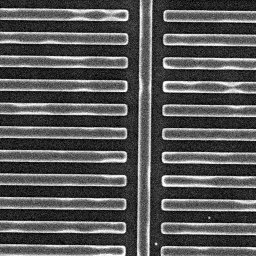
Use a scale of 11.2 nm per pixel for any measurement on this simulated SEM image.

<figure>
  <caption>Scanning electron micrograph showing groups of lines, slits or small figures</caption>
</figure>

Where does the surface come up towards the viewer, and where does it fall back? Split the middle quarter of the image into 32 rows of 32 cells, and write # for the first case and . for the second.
################...###...#######
...................###..........
...................###..........
...................###..........
###############....###..........
################...##....#######
################...##....#######
...................###..........
...................###..........
...................###..........
################...###...#######
################...###...#######
#......#########...###...#######
...................##...........
...................##...........
...................##...........
################...##....#######
################...##....#######
.##############....##....#######
...................##...........
...................##...........
...................##...........
################...##....#######
################...##....#######
.....####..........##....#######
...................##...........
...................##...........
...................##...........
################...##....#######
################...##....#######
...................##...........
...................##...........